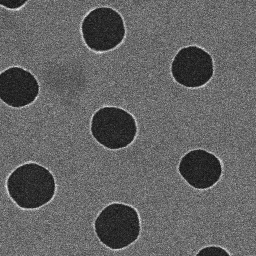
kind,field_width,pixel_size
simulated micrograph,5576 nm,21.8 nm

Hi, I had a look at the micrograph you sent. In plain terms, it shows holes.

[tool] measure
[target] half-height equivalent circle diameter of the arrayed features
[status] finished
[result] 951 nm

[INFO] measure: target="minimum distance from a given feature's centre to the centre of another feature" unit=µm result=2.1